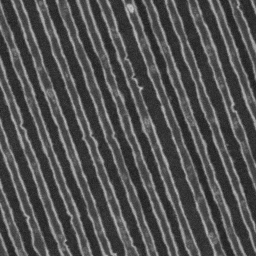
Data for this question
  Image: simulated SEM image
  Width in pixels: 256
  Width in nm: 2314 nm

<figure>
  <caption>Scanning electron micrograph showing parallel lines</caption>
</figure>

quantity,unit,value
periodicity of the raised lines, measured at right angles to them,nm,185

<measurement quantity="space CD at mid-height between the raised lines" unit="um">0.108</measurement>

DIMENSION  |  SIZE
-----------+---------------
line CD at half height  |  77.6 nm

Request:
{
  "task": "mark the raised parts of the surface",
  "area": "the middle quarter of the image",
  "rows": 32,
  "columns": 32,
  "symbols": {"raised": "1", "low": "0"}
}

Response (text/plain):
10001110011100011000011000110001
10000110001100011000011100110001
10000110001100011000011100111000
11000111001110011000001100011000
11000111000110001100001100011000
01100011000110001110000110011100
01100011100010000110000110001100
01110001100011000110000111001100
00110001100011100111000011000110
00110001110001100011000011000110
00110000110001100011000001100110
00011000110001110011100001100011
00011000111000110001100001100011
00011000011000110001110001110011
00001100011000111001110000110001
10001100011100111000110000111001
10001110001100011000111000011000
10000110001100011000111000011000
11000110001110001100011000011100
11000111000110001100011100001100
11100011000111000110001100001100
01100011000011000110001100001110
01100001100011000111000110000110
01110001100001100011000110000111
00110001110001100011000111000111
00110000110001100011100011000011
00110000110001110001100011000011
00011000111000110001110011100011
00011000011000110001110011100001
00011100011000011000110001100001
10001100001100011000110001110000
10001100001100011100011000110000